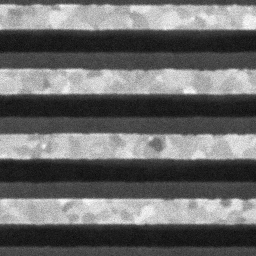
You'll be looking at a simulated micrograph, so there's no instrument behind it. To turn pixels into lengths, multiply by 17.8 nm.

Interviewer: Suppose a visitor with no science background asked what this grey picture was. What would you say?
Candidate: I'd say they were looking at lines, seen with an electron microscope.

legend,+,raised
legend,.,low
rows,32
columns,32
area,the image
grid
++++++++++++++++++++++++++++++++
++++++++++++++++++++++++++++++++
++++++++++++++++++++++++++++++++
++++++++++++++++++++++++++++++++
................................
................................
................................
++++++++++++++++++++++++++++++++
++++++++++++++++++++++++++++++++
++++++++++++++++++++++++++++++++
++++++++++++++++++++++++++++++++
++++++++++++++++++++++++++++++++
................................
................................
................................
++++++++++++++++++++++++++++++++
++++++++++++++++++++++++++++++++
++++++++++++++++++++++++++++++++
++++++++++++++++++++++++++++++++
++++++++++++++++++++++++++++++++
................................
................................
................................
++++++++++++++++++++++++++++++++
++++++++++++++++++++++++++++++++
++++++++++++++++++++++++++++++++
++++++++++++++++++++++++++++++++
++++++++++++++++++++++++++++++++
................................
................................
................................
++++++++++++++++++++++++++++++++